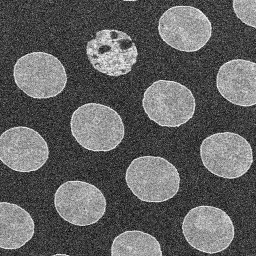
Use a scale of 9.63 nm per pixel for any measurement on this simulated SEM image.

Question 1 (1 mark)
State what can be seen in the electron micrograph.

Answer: a regular array of raised bodies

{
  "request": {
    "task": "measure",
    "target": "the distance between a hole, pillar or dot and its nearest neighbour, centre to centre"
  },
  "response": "732 nm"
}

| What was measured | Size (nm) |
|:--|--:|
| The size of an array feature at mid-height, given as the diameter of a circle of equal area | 469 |